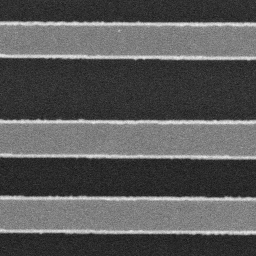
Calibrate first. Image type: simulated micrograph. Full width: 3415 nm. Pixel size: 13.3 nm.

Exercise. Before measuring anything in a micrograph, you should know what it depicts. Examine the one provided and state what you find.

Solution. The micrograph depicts lines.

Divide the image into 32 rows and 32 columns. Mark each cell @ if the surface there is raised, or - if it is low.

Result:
--------------------------------
--------------------------------
--------------------------------
@@@@@@@@@@@@@@@@@@@@@@@@@@@@@@@@
@@@@@@@@@@@@@@@@@@@@@@@@@@@@@@@@
@@@@@@@@@@@@@@@@@@@@@@@@@@@@@@@@
@@@@@@@@@@@@@@@@@@@@@@@@@@@@@@@@
--------------------------------
--------------------------------
--------------------------------
--------------------------------
--------------------------------
--------------------------------
--------------------------------
--------------------------------
@@@@@@@@@@@@@@@@@@@@@@@@@@@@@@@@
@@@@@@@@@@@@@@@@@@@@@@@@@@@@@@@@
@@@@@@@@@@@@@@@@@@@@@@@@@@@@@@@@
@@@@@@@@@@@@@@@@@@@@@@@@@@@@@@@@
@@@@@@@@@@@@@@@@@@@@@@@@@@@@@@@@
--------------------------------
--------------------------------
--------------------------------
--------------------------------
--------------------------------
@@@@@@@@@@@@@@@@@@@@@@@@@@@@@@@@
@@@@@@@@@@@@@@@@@@@@@@@@@@@@@@@@
@@@@@@@@@@@@@@@@@@@@@@@@@@@@@@@@
@@@@@@@@@@@@@@@@@@@@@@@@@@@@@@@@
--------------------------------
--------------------------------
--------------------------------